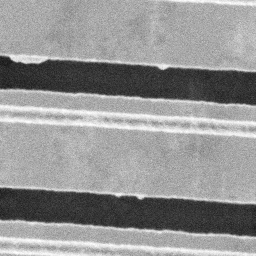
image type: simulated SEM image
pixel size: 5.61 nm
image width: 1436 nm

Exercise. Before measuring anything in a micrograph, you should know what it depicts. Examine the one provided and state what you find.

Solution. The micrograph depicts lines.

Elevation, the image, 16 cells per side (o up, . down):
oooooooooooooooo
oooooooooooooooo
oooooooooooooooo
oooooooooooooooo
................
................
oooooooooooooo..
oooooooooooooooo
oooooooooooooooo
oooooooooooooooo
oooooooooooooooo
oooooooooooooooo
.............ooo
................
ooooooooooo.....
oooooooooooooooo